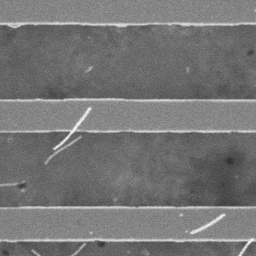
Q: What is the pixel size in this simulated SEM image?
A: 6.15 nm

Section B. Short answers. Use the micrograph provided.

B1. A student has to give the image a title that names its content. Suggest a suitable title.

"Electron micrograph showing lines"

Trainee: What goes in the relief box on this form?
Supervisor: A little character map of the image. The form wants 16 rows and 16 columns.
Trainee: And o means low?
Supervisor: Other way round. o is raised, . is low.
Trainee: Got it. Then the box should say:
oooooooooooooooo
......oooo..ooo.
................
................
................
................
oooooooooooooooo
oooooooooooooooo
................
................
................
................
................
oooooooooooooooo
oooooooooooooooo
................